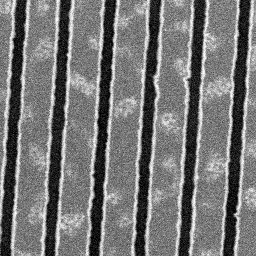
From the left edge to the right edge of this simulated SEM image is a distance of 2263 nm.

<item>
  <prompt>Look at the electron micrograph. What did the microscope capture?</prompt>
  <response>parallel lines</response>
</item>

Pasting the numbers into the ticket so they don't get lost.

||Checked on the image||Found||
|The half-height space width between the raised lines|112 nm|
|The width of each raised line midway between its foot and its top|289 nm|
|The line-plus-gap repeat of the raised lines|0.395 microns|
